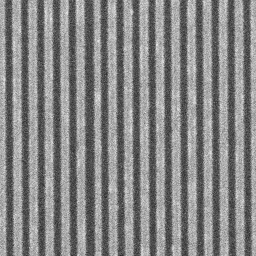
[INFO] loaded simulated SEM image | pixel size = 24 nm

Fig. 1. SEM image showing parallel lines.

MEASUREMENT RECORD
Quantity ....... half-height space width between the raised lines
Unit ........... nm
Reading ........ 213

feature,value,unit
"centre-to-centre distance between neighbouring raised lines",0.381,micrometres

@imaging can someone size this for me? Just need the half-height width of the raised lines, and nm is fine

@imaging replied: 168